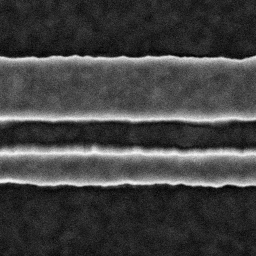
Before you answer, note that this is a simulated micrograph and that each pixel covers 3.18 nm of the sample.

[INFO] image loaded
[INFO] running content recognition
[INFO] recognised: lines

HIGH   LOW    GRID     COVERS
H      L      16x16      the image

LLLLLLLLLLLLLLLL
LLLLLLLLLLLLLLLL
LLLLLLLLLLLLLLLL
LLLLLLLLLLLLLLLL
HHHHHHHHHHHHHHHH
HHHHHHHHHHHHHHHH
HHHHHHHHHHHHHHHH
HHHHHHHHHHHHHHHH
HHHHHHHHHHHHHHHH
HHHHHHHHHHHHHHHH
HHHHHHHHHHHHHHHH
LLHHHHHHLLLHHHHH
LLLLLLLLLLLLLLLL
LLLLLLLLLLLLLLLL
LLLLLLLLLLLLLLLL
LLLLLLLLLLLLLLLL